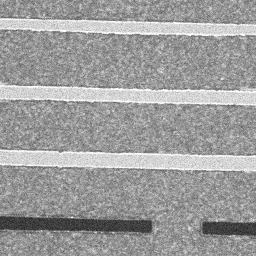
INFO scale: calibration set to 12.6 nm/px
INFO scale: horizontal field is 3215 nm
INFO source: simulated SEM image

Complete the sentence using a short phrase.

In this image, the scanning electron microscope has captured one or a few lines or trenches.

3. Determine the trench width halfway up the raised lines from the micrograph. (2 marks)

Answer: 51.6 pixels